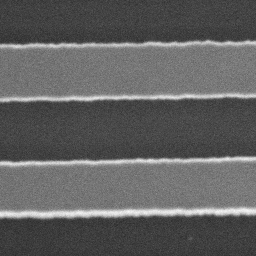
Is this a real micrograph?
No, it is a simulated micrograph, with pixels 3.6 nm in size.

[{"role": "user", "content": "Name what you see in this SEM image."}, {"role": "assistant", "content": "lines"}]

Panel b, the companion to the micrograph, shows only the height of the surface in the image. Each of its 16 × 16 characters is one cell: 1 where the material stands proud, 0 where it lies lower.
0000000000000000
0000000000000000
0000000000000000
1111111111111111
1111111111111111
1111111111111111
0000000000000000
0000000000000000
0000000000000000
0000000000000000
1111111111111111
1111111111111111
1111111111111111
0000000000000000
0000000000000000
0000000000000000